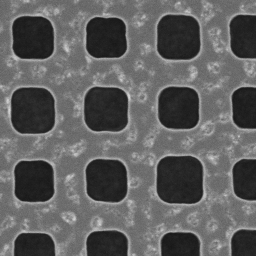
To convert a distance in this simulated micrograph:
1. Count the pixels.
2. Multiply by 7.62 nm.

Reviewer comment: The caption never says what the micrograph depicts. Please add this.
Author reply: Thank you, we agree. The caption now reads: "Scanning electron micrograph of a regular array of holes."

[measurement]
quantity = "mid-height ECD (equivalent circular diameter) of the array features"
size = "347 nm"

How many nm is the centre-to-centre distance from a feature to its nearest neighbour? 544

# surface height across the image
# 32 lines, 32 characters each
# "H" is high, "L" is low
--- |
HHHHHHHHHHHHHHHHHHHHHHHHHHHHHHHH
HHHHHHHHHHHHHHHHHHHHHHHHHHHHHHHH
HHLLLLHHHHHLLLLHHHHHLLLLHHHHHLLL
HHLLLLLHHHHLLLLLHHHHLLLLLHHHHLLL
HHLLLLLHHHHLLLLLHHHHLLLLLHHHHLLL
HHLLLLLHHHHLLLLLHHHHLLLLLHHHHLLL
HHLLLLLHHHHLLLLLHHHHLLLLLHHHHLLL
HHHHHHHHHHHHHHHHHHHHHHLHHHHHHHHH
HHHHHHHHHHHHHHHHHHHHHHHHHHHHHHHH
HHHHHHHHHHHHHHHHHHHHHHHHHHHHHHHH
HHHHHHHHHHHHHHHHHHHHHHHHHHHHHHHH
HHLLLLHHHHHLLLLLHHHHLLLLLHHHHLLL
HLLLLLLHHHHLLLLLHHHHLLLLLHHHHLLL
HLLLLLLHHHLLLLLLHHHHLLLLLHHHHLLL
HLLLLLLHHHLLLLLLHHHHLLLLLHHHHLLL
HHLLLLLHHHHLLLLLHHHHLLLLLHHHHLLL
HHLLLLHHHHHHHHHHHHHHHHHHHHHHHHHH
HHHHHHHHHHHHHHHHHHHHHHHHHHHHHHHH
HHHHHHHHHHHHHHHHHHHHHHHHHHHHHHHH
HHHHHHHHHHHHHHHHHHHHHLHHHHHHHHHH
HHLLLLHHHHHLLLLHHHHHLLLLLHHHHLLL
HHLLLLLHHHHLLLLLHHHHLLLLLHHHHLLL
HHLLLLLHHHHLLLLLHHHHLLLLLHHHHLLL
HHLLLLLHHHHLLLLLHHHLLLLLLHHHHLLL
HHLLLLLHHHHLLLLLHHHHLLLLLHHHHHLL
HHHHHHHHHHHHHHHHHHHHHHHLHHHHHHHH
HHHHHHHHHHHHHHHHHHHHHHHHHHHHHHHH
HHHHHHHHHHHHHHHHHHHHHHHHHHHHHHHH
HHHHHHHHHHHHHHHHHHHHHHHHHHHHHHHH
HHLLLLHHHHHLLLLLHHHHHLLLHHHHHLLL
HHLLLLLHHHHLLLLLHHHHLLLLLHHHHLLL
HHLLLLLHHHHLLLLLHHHHLLLLLHHHHLLL